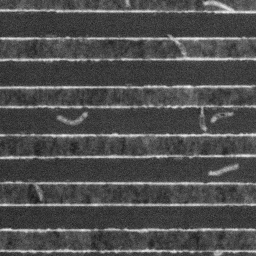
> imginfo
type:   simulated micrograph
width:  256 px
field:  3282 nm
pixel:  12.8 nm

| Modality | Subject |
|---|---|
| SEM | lines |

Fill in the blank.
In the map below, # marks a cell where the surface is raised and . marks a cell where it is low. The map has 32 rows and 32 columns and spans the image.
################################
...........................#####
................................
................................
................................
################################
################################
#####...##.##...................
................................
................................
................................
################################
################################
.........................#......
................................
................................
................................
################################
################################
################################
................................
................................
................................
################################
################################
################################
................................
................................
................................
################################
################################
................................